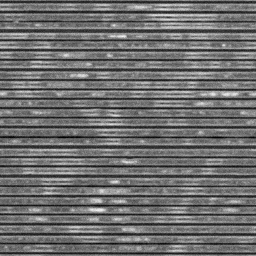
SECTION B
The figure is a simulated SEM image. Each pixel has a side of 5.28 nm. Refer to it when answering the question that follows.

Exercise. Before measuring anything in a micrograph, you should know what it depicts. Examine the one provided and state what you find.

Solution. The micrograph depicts parallel lines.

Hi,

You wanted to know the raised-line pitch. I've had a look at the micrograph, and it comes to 9.64 pixels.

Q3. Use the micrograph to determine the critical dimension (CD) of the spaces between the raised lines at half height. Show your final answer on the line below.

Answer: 13.2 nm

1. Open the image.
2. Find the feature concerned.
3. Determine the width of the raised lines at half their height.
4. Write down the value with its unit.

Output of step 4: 35.6 nanometres